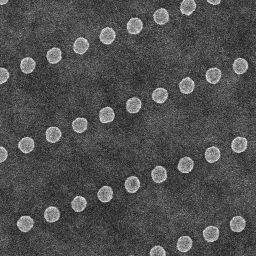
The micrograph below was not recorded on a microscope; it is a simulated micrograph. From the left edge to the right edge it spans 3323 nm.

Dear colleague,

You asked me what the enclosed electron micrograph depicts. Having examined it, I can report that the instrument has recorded a regular array of raised bodies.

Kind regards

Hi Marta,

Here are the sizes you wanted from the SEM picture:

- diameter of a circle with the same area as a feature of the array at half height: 0.199 um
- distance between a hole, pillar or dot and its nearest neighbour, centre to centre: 0.367 µm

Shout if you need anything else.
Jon